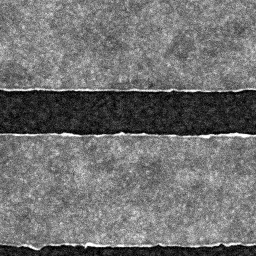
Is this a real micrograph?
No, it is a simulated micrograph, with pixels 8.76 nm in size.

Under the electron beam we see one or a few lines or trenches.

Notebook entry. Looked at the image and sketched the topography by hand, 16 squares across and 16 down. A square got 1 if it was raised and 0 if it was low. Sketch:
1111111111111111
1111111111111111
1111111111111111
1111111111111111
1111111111111111
1111111111111111
0000000000000000
0000000000000000
1111111111100111
1111111111111111
1111111111111111
1111111111111111
1111111111111111
1111111111111111
1111111111111111
0000000000000000